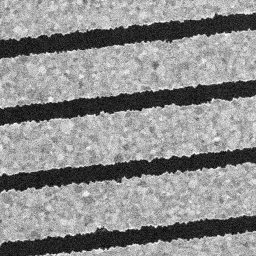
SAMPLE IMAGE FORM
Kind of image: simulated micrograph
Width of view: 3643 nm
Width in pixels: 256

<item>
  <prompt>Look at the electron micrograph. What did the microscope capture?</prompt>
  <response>one or a few lines or trenches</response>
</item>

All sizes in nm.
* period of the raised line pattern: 950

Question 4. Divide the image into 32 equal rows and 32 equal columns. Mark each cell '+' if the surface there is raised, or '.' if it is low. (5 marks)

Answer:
++++++++++++++++++++++++++++++++
++++++++++++++++++++++++++++++++
+++++++++++++++++++++++.........
++++++++++++++..................
+++++...................++++++++
................++++++++++++++++
........++++++++++++++++++++++++
++++++++++++++++++++++++++++++++
++++++++++++++++++++++++++++++++
++++++++++++++++++++++++++++++++
++++++++++++++++++++++++++......
+++++++++++++++++...............
++++++++...................+.+++
...................+++++++++++++
...........+++++++++++++++++++++
..++++++++++++++++++++++++++++++
++++++++++++++++++++++++++++++++
++++++++++++++++++++++++++++++++
+++++++++++++++++++++++++++++++.
++++++++++++++++++++++..........
++++++++++++.+.................+
+++...................++++++++++
...............+++++++++++++++++
.....+++++++++++++++++++++++++++
++++++++++++++++++++++++++++++++
++++++++++++++++++++++++++++++++
++++++++++++++++++++++++++++++++
+++++++++++++++++++++++++.......
++++++++++++.++++...............
++++++++....................++++
...................+++++++++++++
..........++++++++++++++++++++++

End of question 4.